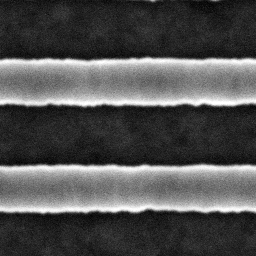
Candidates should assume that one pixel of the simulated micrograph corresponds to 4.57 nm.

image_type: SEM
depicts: lines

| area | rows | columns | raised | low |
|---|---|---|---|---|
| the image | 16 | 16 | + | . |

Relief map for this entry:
................
................
................
................
++++++++++++++++
++++++++++++++++
..+..+..+++..++.
................
................
................
++++++++++++++++
++++++++++++++++
++++++++++++++++
................
................
................